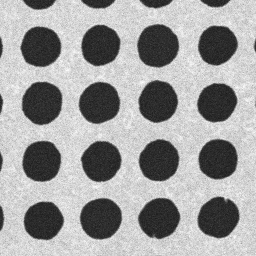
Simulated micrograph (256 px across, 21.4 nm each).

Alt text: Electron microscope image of a regular array of holes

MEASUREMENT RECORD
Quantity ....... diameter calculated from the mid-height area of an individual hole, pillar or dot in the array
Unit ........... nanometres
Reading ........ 881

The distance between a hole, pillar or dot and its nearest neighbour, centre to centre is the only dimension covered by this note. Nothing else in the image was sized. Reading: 1230 nm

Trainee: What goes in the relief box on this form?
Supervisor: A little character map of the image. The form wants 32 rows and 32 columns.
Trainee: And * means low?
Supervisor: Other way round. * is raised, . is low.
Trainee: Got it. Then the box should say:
***....****...****...*****..****
********************************
********************************
****..*****...****...*****...***
***....***.....**.....***....***
***.....**.....**.....***.....**
***.....**.....**.....***....***
***....****...****....***....***
********************************
********************************
****...****...****...******.****
***.....**.....***....***....***
***.....**.....**.....***.....**
***.....**.....**.....***....***
***....***....****....***....***
****..**************************
********************************
*******************..*****..****
***....****....***....***....***
***.....**.....**.....***.....**
***.....**.....**.....***.....**
***....****....***....***....***
****..*****...*****..***********
********************************
********************************
****...****....***....****...***
***.....**.....***....***.....**
.**.....**.....**.....***.....**
***.....**.....***....***....***
****...****...*****..*****..****
********************************
********************************